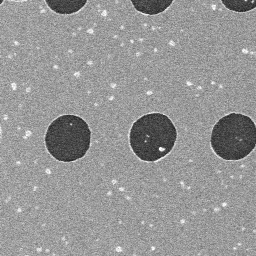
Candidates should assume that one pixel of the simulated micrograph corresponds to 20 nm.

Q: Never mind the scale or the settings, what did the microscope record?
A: holes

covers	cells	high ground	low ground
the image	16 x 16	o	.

ooo..ooo..oooo..
oooooooooooooooo
oooooooooooooooo
oooooooooooooooo
oooooooooooooooo
oooooooooooooooo
oooooooooooooooo
ooo..oooo..ooo..
ooo...oo...oo...
ooo..ooo...oo...
oooooooooooooooo
oooooooooooooooo
oooooooooooooooo
oooooooooooooooo
oooooooooooooooo
oooooooooooooooo